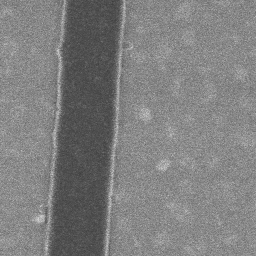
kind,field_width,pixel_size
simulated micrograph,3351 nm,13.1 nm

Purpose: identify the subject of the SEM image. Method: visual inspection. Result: one or a few lines or trenches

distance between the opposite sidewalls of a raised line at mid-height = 810 nanometres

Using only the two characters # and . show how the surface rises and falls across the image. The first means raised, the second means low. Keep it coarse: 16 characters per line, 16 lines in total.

....####........
....####........
....####........
....####........
....####........
....###.........
....###.........
...####.........
...####.........
...####.........
...####.........
...####.........
...####.........
...####.........
...####.........
...####.........